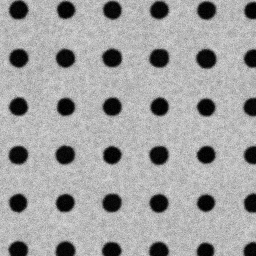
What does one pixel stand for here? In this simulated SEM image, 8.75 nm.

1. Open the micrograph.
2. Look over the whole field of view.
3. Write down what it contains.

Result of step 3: a regular array of holes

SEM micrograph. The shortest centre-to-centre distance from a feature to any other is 409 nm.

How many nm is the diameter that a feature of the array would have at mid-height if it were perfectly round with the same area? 163